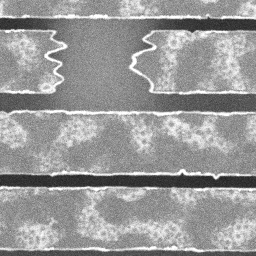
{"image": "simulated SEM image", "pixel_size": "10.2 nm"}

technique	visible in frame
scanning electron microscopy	one or a few lines or trenches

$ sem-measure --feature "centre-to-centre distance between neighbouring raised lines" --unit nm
792